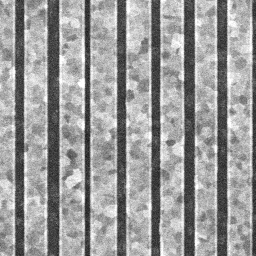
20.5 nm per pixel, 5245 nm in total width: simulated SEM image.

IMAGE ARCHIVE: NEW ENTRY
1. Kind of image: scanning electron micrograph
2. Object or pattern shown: parallel lines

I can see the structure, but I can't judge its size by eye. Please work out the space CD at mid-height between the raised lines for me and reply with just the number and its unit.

11.6 px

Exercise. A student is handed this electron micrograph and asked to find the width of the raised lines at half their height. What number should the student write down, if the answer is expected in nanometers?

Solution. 479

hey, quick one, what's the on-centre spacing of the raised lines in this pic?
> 0.696 micrometres